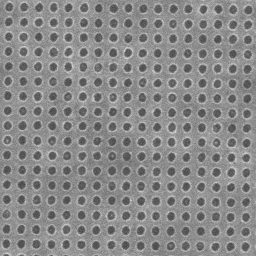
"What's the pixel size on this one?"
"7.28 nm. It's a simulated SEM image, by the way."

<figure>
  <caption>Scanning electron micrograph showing a regular array of holes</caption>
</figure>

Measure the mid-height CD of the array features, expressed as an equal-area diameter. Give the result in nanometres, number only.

65.7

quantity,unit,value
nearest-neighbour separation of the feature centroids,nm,106